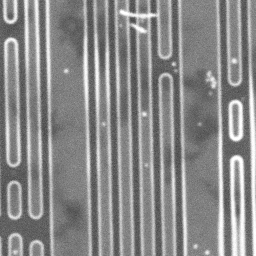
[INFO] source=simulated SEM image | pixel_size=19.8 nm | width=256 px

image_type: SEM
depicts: groups of lines, slits or small figures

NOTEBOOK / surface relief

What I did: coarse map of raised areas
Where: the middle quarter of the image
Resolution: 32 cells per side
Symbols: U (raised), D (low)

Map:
UUUUUDDDUUUDDUUUDDDUUDDDDDDDDUUU
UUUUUDDDUUUDDUUUDDDUUDDDDDDDDUUU
UUUUUDDDUUUDDDUUDDDUUDDDDUDDDUUU
UUUUUDDDUUUDDDUUDDDUUDDDUUUDDUUU
UUUUUDDDUUUDDDUUDDDUUUDDUUUDDUUU
UUUUUDDDUUUDDDUUDDDUUUDDUUUDDUUU
UUUUUUDDUUUDDDUUDDDUUUDDUUUDDUUU
UUUUUUDDUUUDDDUUDDDUUUDDUUUDDUUU
UUUUUUDDUUUDDDUUDDDUUUDDUUUDDUUU
UUUUUUDDUUUDDDUUDDDUUUDDUUUDDUUU
UUUUUUDDUUUDDDUUDDDUUUDDUUUDDUUU
UUUUUUDDUUUDDDUUDDDUUUDDUUUDDDUU
UUUUUUDDUUUDDDUUDDDUUUDDUUUDDDUU
UUUUUUDDUUUDDDUUDDDUUUDDUUUDDDUU
UUUUUUDDUUUDDDUUDDDUUUDDUUUDDDUU
UUUUUUDDDUUDDDUUUDDUUUDDUUUDDDUU
UUUUUUDDDUUDDDUUUDDUUUDDUUUDDDUU
UUUUUUDDDUUDDDUUUDDUUUDDUUUDDDUU
UUUUUUDDDUUDDDUUUDDUUUDDUUUDDDUU
UUUUUUDDDUUDDDUUUDDUUUDDUUUDDDUU
UUUUUUDDDUUDDDUUUDDUUUDDUUUDDDUU
UUUUUUDDDUUDDDUUUDDUUUDDUUUDDDUU
UUUUUUDDDUUDDDUUUDDUUUDDUUUDDDUU
UUUUUUDDDUUDDDUUUDDUUUDDUUUDDDUU
UUUUUUDDDUUDDDUUUDDUUUDDDUUDDDUU
UUUUUUDDDUUDDDUUUDDUUUDDDUUDDDUU
UUUUUUDDDUUDDDUUUDDUUUDDDUUDDDUU
UUUUUUDDDUUDDDUUUDDUUUDDDUUDDDUU
UUUUUUDDDUUUDDUUUDDUUUDDDUUDDDUU
UUUUUUDDDUUUDDUUUDDUUUDDDUUDDDUU
UUUUUUDDDUUUDDUUUDDUUUDDDUUDDDUU
UUUUUUDDDUUUDDUUUDDUUUDDDUUDDDUU